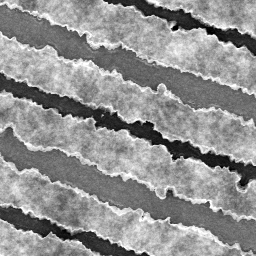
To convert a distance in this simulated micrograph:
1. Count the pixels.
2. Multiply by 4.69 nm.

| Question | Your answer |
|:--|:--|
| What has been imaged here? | parallel lines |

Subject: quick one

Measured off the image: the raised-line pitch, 0.285 µm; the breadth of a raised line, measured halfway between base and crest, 182 nm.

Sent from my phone